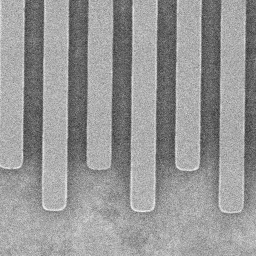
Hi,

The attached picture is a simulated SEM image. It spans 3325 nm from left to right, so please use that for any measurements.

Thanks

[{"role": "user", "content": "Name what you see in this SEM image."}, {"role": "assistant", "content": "groups of lines, slits or small figures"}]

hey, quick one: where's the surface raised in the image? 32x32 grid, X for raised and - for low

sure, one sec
XXX---XX---XXX---XXX--XXX---XXX-
XXX---XX---XXX---XXX--XXX---XXX-
XXX---XX---XXX---XXX--XXX---XXX-
XXX---XX---XXX---XXX--XXX---XXX-
XXX---XX---XXX---XXX--XXX---XXX-
XXX---XX---XXX---XXX--XXX---XXX-
XXX---XX---XXX---XXX--XXX---XXX-
XXX---XX---XXX---XXX--XXX---XXX-
XXX---XX---XXX---XXX--XXX---XXX-
XXX---XX---XXX---XXX--XXX---XXX-
XXX---XX---XXX---XXX--XXX---XXX-
XXX---XX---XXX---XXX--XXX---XXX-
XXX---XX---XXX---XX---XXX---XXX-
XXX---XX---XXX---XX---XXX---XXX-
XXX---XX---XXX---XX---XXX---XXX-
XXX---XX---XXX---XX---XXX---XXX-
XXX--XXX---XXX---XX---XXX---XX--
XXX--XXX---XXX---XX---XXX---XX--
XXX--XXX---XXX--XXX---XXX---XX--
XXX--XXX---XXX--XXX---XXX---XX--
XXX--XXX---XXX--XXX---XXX---XX--
-----XXX--------XXX---------XX--
-----XXX--------XXX---------XX--
-----XXX--------XXX--------XXX--
-----XXX--------XXX--------XXX--
-----XXX--------XXX--------XXX--
----------------------------XX--
--------------------------------
--------------------------------
--------------------------------
--------------------------------
--------------------------------